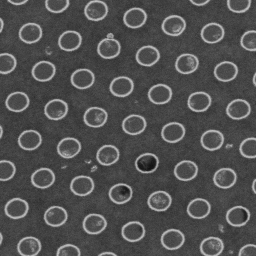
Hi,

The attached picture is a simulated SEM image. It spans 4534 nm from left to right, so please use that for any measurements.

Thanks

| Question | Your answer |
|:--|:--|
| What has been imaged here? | a regular array of raised bodies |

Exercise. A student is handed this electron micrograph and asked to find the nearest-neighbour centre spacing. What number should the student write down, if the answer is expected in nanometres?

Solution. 702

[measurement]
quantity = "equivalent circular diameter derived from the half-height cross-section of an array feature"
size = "363 nanometers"